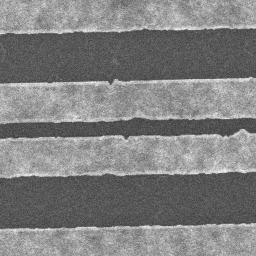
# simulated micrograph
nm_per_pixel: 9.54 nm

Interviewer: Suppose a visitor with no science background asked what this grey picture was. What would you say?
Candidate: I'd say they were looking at one or a few lines or trenches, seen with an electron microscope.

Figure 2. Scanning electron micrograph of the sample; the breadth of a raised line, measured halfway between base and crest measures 347 nm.